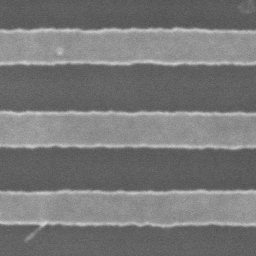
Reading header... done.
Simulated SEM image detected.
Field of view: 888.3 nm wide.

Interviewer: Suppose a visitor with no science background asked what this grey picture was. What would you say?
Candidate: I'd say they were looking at lines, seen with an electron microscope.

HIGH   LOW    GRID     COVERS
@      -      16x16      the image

----------------
----------------
@@@@@@@@@@@@@@@@
@@@@@@@@@@@@@@@@
----------------
----------------
----------------
@@@@@@@@@@@@@@@@
@@@@@@@@@@@@@@@@
----------------
----------------
----------------
@@@@@@@@@@@@@@@@
@@@@@@@@@@@@@@@@
----------------
----------------